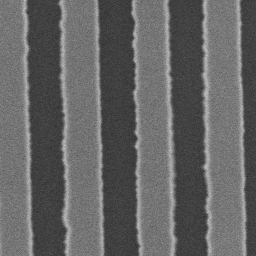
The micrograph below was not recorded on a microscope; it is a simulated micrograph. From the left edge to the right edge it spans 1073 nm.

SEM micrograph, lines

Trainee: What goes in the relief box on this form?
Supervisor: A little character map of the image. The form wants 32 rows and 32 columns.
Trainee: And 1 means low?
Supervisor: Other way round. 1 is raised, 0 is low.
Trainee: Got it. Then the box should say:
11100000111100000111100001111100
11100000111100000111100000111100
11100000111100000111100000111100
11100000111100000111100001111100
11100000111100000111100000111100
11100000111100000111100000111100
11100000111100000111100000111100
11100000111100000111100000111100
11100000111100000111100000111100
11100000111100000111100000111100
11100000111100000111100000111100
11100000111100000111100000111100
11110000111100000111100000111100
11100000111100000111100000111100
11100000111110000111100000111100
11110000111110000111100000111100
11110000111100000111100000111100
11110000111110000111100000111100
11110000111110000111100000111100
11110000111110000111100000111100
11110000111110000111110000111100
11110000111110000111110000111100
11110000111110000111110000111110
11110000111110000111110000111100
11110000111110000111110000111110
11110000111110000111110000111110
11110000111110000111110000111110
11110000111110000111110000111110
11110000111110000111110000111110
11110000111110000111110000111110
11110000111110000111110000111110
11110000111110000111110000111110